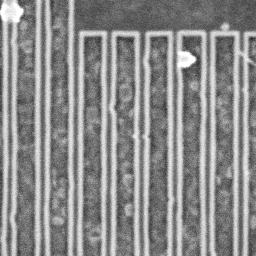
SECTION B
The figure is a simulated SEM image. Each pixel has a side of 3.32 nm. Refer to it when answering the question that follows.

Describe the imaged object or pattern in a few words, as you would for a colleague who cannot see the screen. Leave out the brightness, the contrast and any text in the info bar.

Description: parallel lines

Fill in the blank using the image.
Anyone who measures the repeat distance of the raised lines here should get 110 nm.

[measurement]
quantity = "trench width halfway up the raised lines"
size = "76 nm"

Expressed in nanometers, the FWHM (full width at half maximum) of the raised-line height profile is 34.9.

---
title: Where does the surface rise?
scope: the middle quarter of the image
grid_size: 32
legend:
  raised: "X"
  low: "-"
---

--XX------XX------XXX-----XXX-X-
--XX------XX------XXX-----XXX---
--XX------XX------XXX-----XXX---
--XX------XX------XXX-----XXX---
--XX------XX------XXX-----XXX---
--XX------XX------XXX-----XXX---
--XX------XX------XXX-----XXX---
--XX------XX------XXX------XX---
--XX------XX------XXX------XX---
--XX------XX------XXX------XX---
--XX------XX------XXX------XX---
--XX------XX------XXX------XX---
--XX------XX------XXX------XX---
--XX------XXX-----XXX------XX---
--XX------XXX-----XXX------XX---
--XX------XXX-----XXX------XX---
--XX------XXX-----XXX------XX---
--XX------XXX-----XXX------XX---
--XX------XXX-----XXX------XX---
--XX------XXX-----XXX------XX---
--XX------XX------XXX------XX---
--XX------XX------XXX------XX---
--XX------XX------XXX------XX---
--XX------XXX-----XXX------XX---
--XX------XXX-----XXX------XX---
--XX------XXX-----XX-------XX---
--XX------XXX-----XXX------XX---
--XX------XX------XXX------XX---
--XX------XXX-----XXX------XX---
--XX------XX------XXX------XX---
--XX------XX------XX-------XX---
--XX------XX------XX-------XX---